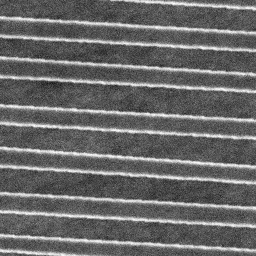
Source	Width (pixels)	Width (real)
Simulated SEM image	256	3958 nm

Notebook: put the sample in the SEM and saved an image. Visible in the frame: lines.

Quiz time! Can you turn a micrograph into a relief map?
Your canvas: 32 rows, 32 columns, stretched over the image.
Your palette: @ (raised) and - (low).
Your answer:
---------------------@@@@@@@@@@@
--------------------------------
@@@@@@@-------------------------
@@@@@@@@@@@@@@@@@@@@@@----------
@@@@@@@@@@@@@@@@@@@@@@@@@@@@@@@@
---------------@@@@@@@@@@@@@@@@@
--------------------------------
@@@@@@--------------------------
@@@@@@@@@@@@@@@@@@@@------------
@@@@@@@@@@@@@@@@@@@@@@@@@@@@@@@@
--------------@@@@@@@@@@@@@@@@@@
-------------------------------@
--------------------------------
@@@@@@--------------------------
@@@@@@@@@@@@@@@@@@@@@@@---------
-@@@@@@@@@@@@@@@@@@@@@@@@@@@@@@@
----------------@@@@@@@@@@@@@@@@
--------------------------------
@-------------------------------
@@@@@@@@@@@@@@------------------
@@@@@@@@@@@@@@@@@@@@@@@@@@@@----
----------@@@@@@@@@@@@@@@@@@@@@@
--------------------------@@@@@@
--------------------------------
@@@@@@@-------------------------
@@@@@@@@@@@@@@@@@@@@@@@---------
@@@@@@@@@@@@@@@@@@@@@@@@@@@@@@@@
----------------@@@@@@@@@@@@@@@@
--------------------------------
@@------------------------------
@@@@@@@@@@@@@@@@@@@-------------
--@@@@@@@@@@@@@@@@@@@@@@@@@@@@@@